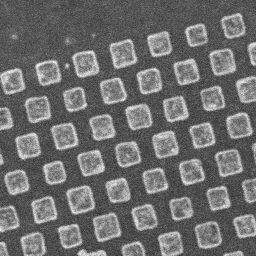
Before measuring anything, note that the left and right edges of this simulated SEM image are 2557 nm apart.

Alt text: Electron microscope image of a regular array of raised bodies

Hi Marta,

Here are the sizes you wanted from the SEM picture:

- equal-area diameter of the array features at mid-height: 0.234 micrometres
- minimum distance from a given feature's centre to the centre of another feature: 0.373 um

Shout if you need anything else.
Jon